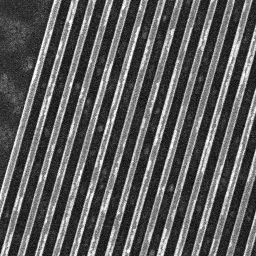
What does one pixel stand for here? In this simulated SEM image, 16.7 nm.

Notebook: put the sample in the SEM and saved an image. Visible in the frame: parallel lines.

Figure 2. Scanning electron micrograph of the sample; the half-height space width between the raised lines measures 179 nm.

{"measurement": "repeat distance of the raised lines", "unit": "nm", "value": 279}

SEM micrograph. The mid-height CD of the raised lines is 98.4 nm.